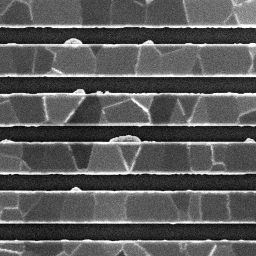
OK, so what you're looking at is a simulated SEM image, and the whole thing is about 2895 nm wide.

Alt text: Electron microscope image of lines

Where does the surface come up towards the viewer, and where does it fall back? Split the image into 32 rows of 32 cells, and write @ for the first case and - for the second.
@@@@@@@@@@@@@@@@@@@@@@@@@@@@@@@@
@@@@@@@@@@@@@@@@@@@@@@@@@@@@@@@@
@@@@@@@@@@@@@@@@@@@@@@@@@@@@@@@@
--------------------------------
--------------------------------
-@---------------------@------@@
@@@@@@@@@@@@@@@@@@@@@@@@@@@@@@@@
@@@@@@@@@@@@@@@@@@@@@@@@@@@@@@@@
@@@@@@@@@@@@@@@@@@@@@@@@@@@@@@@@
@@@@@@@@@@@@@@@@@@@@@@@@@@@@@@@@
--------------------------------
--------------------------------
@@@@@@@@@@@@@@@@@@@@@@@@@@@@@@@@
@@@@@@@@@@@@@@@@@@@@@@@@@@@@@@@@
@@@@@@@@@@@@@@@@@@@@@@@@@@@@@@@@
@@@@@@@@@@@@@@@@@@@@@@@@@@@@@@@@
--------------------------------
--------------------------------
@@@@@@@@@@@@@@@@@@@@@@@@@@@@@@@@
@@@@@@@@@@@@@@@@@@@@@@@@@@@@@@@@
@@@@@@@@@@@@@@@@@@@@@@@@@@@@@@@@
@@@@@@@@@@@@@@@@@@@@@@@@@@@@@@@@
--------------------------------
--------------------------------
@@@@@@@@@@@@@@@@@@@@@@@@@@@@@@@@
@@@@@@@@@@@@@@@@@@@@@@@@@@@@@@@@
@@@@@@@@@@@@@@@@@@@@@@@@@@@@@@@@
@@@@@@@@@@@@@@@@@@@@@@@@@@@@@@@@
--------------------------------
--------------------------------
@@@@@@@@@@@@@@@@@@@@@@@@@@@@@@@@
@@@@@@@@@@@@@@@@@@@@@@@@@@@@@@@@